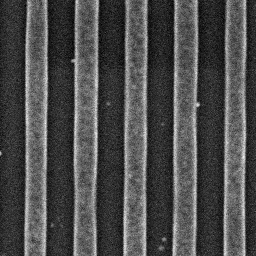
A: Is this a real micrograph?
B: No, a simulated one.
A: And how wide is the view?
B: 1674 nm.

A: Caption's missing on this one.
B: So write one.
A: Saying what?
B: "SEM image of wiring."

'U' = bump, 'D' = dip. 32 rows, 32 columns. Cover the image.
DDDUUUDDDDUUDDDDUUDDDDUUUDDDUUUD
DDDUUUDDDUUUDDDDUUDDDDUUUDDDUUUD
DDDUUUDDDUUUDDDDUUDDDDUUUDDDUUUD
DDDUUUDDDUUUDDDDUUDDDDUUUDDDUUUD
DDDUUUDDDUUUDDDDUUDDDDUUUDDDUUUD
DDDUUUDDDUUUDDDDUUDDDDUUUDDDUUUD
DDDUUUDDDUUUDDDDUUDDDDUUUDDDUUUD
DDDUUUDDDUUUDDDDUUDDDDUUUDDDUUUD
DDDUUUDDDUUUDDDDUUDDDDUUUDDDUUDD
DDDUUUDDDUUUDDDDUUDDDDUUDDDDUUDD
DDDUUUDDDUUUDDDDUUDDDDUUDDDDUUDD
DDDUUUDDDUUUDDDDUUDDDDUUDDDDUUDD
DDDUUUDDDUUUDDDDUUDDDDUUDDDDUUDD
DDDUUUDDDUUUDDDDUUDDDDUUDDDDUUUD
DDDUUUDDDUUUDDDDUUDDDDUUDDDDUUUD
DDDUUUDDDUUUDDDDUUDDDDUUDDDDUUUD
DDDUUUDDDUUUDDDDUUDDDDUUDDDDUUUD
DDDUUUDDDUUUDDDDUUDDDDUUDDDDUUUD
DDDUUUDDDUUUDDDDUUDDDDUUDDDDUUUD
DDDUUUDDDUUUDDDDUUDDDDUUDDDDUUUD
DDDUUUDDDUUUDDDDUUDDDDUUDDDDUUDD
DDDUUUDDDUUUDDDDUUDDDDUUDDDDUUDD
DDDUUUDDDUUUDDDDUUDDDDUUDDDDUUDD
DDDUUUDDDUUUDDDDUUDDDDUUDDDDUUDD
DDDUUUDDDUUUDDDDUUDDDDUUDDDDUUDD
DDDUUUDDDUUUDDDDUUDDDDUUDDDDUUDD
DDDUUUDDDUUUDDDDUUDDDDUUDDDDUUDD
DDDUUUDDDUUUDDDDUUDDDDUUDDDDUUDD
DDDUUUDDDUUUDDDDUUDDDDUUDDDDUUDD
DDDUUUDDDUUUDDDDUUDDDDUUDDDDUUDD
DDDUUUDDDUUUDDDDUUDDDDUUDDDDUUUD
DDDUUUDDDUUUDDDDUUDDDDUUDDDDUUUD